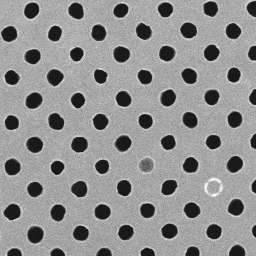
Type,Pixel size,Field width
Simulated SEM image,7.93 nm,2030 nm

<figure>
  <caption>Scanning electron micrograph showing a regular array of holes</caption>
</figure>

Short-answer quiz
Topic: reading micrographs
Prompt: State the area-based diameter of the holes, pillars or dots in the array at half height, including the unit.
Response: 0.118 µm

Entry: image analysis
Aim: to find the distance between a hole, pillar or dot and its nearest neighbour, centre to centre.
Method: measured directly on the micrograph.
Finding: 245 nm